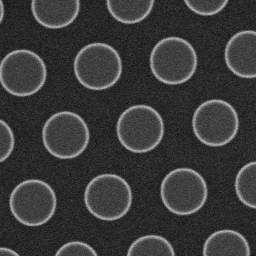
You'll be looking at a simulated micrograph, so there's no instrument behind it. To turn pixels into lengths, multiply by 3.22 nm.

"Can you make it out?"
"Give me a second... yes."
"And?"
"an array of small figures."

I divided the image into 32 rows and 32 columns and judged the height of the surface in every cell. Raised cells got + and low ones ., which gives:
....++++++...++++++....+++++....
....++++++....+++++.....+++.....
.....++++......+++..............
................................
.............................+++
...........++.......++++....++++
..++......++++.....+++++....++++
+++++....++++++....++++++...++++
++++++...++++++....+++++.....+++
++++++....+++++....+++++......++
+++++.....++++..................
.+++............................
................................
................+++......++++...
.......+++.....+++++....++++++..
+.....+++++....+++++....++++++..
+....++++++....+++++....++++++..
++...++++++....+++++.....++++...
++....+++++.....+++.............
+......++.......................
...............................+
.....................+++......++
............+++.....+++++.....++
..++++.....+++++....++++++...+++
.++++++....+++++....++++++....++
.++++++....+++++.....++++......+
..+++++....+++++......++........
..++++.......+..................
................................
..................++......++++..
........+++......++++.....+++++.
++.....+++++....++++++...++++++.